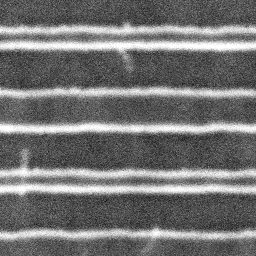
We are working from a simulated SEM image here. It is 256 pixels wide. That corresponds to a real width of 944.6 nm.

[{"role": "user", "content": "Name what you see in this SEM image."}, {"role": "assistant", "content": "lines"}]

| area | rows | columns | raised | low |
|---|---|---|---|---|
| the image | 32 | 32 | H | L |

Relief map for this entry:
LLLLLLLLLLLLLLLLLLLLLLLLLLLLLLLL
LLLLLLLLLLLLLLLLLLLLLLLLLLLLLLLL
LLLLLLLLLLLLLLLLLLLLLLLLLLLLLLLL
LLLLLLLLLLHLLLLLLLLLHHLLLLLLLLLL
HHHHHHHHHHHHHHHHHHHHHHHHHHHHHHHH
HHHHHHHHHHHHHHHHHHHHHHHHHHHHHHHH
LLLLLLLLLLLLLLLLLLLLLLLLLLLLLLLL
LLLLLLLLLLLLLLLLLLLLLLLLLLLLLLLL
LLLLLLLLLLLLLLLLLLLLLLLLLLLLLLLL
LLLLLLLLLLLLLLLLLLLLLLLLLLLLLLLL
LLLLLLLLLLLLLLLLLLLLLLLLLLLLLLLL
HHLLLHHHHHHHHHHHHHHHHHHHHHLLLHHH
HHHHHHHHHHHHHHHHHHHHHHHHHHHHHHHH
HHHHHHHHHHHHHHHHHHHHHHHHHHHHHHHH
HHHHHHHHHHHHHHHHHHHHHHHHHHHHHHHH
HHHHHHHHHHHHHHHHHHHHHHHHHHHHHHHH
LLLLLLLLLLLLLLLLLLLLLLLLLLLLLLLL
LLLLLLLLLLLLLLLLLLLLLLLLLLLLLLLL
LLLLLLLLLLLLLLLLLLLLLLLLLLLLLLLL
LLLLLLLLLLLLLLLLLLLLLLLLLLLLLLLL
LLLLLLLLLLLLLLLLLLLLLLLLLLLLLLLL
LLHHHHLHHHHLLLLLHLLLLLLLLLLLLLLH
HHHHHHHHHHHHHHHHHHHHHHHHHHHHHHHH
HHHHHHHHHHHHHHHHHHHHHHHHHHHHHHHH
LLLLLLLLLLLLLLLLLLLLLLLLLLLLLLLL
LLLLLLLLLLLLLLLLLLLLLLLLLLLLLLLL
LLLLLLLLLLLLLLLLLLLLLLLLLLLLLLLL
LLLLLLLLLLLLLLLLLLLLLLLLLLLLLLLL
LLLLLLLLLLLLLLLLLLLLLLLLLLLLLLLL
HHHHHHHHHHHHHHHHHHHHHHHHHHHHHHHH
HHHHHHHHHHHHHHHHHHHHHHHHHHHHHHHH
HHHHHHHHHHHHHHHHHHHHHHHHHHHHHHHH